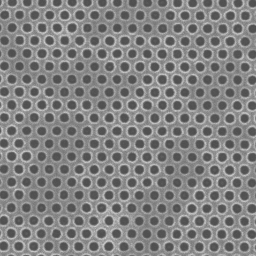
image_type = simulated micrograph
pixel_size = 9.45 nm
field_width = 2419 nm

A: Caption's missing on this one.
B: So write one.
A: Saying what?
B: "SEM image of a regular array of holes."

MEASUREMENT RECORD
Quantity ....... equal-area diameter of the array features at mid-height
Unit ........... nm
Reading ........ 86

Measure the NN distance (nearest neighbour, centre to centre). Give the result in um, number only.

0.137